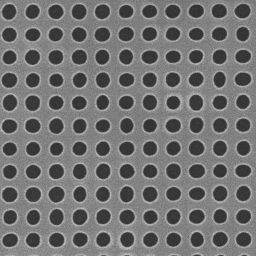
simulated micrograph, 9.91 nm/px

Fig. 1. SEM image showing a regular array of holes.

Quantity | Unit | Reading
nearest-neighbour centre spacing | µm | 0.225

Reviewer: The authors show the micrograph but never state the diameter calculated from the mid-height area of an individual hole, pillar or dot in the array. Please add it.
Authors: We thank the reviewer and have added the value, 147 nm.